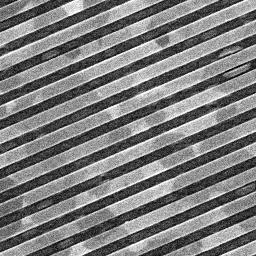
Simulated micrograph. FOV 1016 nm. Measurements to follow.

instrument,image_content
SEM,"parallel lines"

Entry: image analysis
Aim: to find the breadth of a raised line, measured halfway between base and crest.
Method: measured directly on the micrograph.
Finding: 46.9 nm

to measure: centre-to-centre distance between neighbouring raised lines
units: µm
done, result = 0.0891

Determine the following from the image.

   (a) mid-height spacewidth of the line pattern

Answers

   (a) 40.5 nanometres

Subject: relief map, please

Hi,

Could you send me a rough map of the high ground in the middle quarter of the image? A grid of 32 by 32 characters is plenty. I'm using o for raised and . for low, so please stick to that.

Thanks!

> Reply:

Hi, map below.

.......oooooooo......oooooooo...
.....oooooooo......ooooooo......
...ooooooo.......ooooooo.......o
.ooooooo.......ooooooo.......ooo
oooooo......oooooooo.......ooooo
ooo.......ooooooo.......oooooooo
o.......ooooooo.......ooooooo...
.....oooooooo.......ooooooo.....
...ooooooo.......oooooooo......o
.ooooooo.......ooooooo.......ooo
oooooo.......ooooooo.......ooooo
ooo.......oooooooo......oooooooo
o.......ooooooo.......ooooooo...
......ooooooo.......ooooooo.....
....ooooooo......oooooooo.......
.ooooooo.......ooooooo.......ooo
oooooo.......ooooooo.......ooooo
oooo......oooooooo.......ooooooo
oo......ooooooo........ooooooo..
......ooooooo.......oooooooo....
....ooooooo.......ooooooo.......
.oooooooo.......ooooooo......ooo
oooooo.......oooooooo......ooooo
oooo.......ooooooo.......ooooooo
oo.......ooooooo.......ooooooo..
......oooooooo......oooooooo....
....ooooooo.......ooooooo.......
..ooooooo.......ooooooo.......oo
ooooooo......oooooooo.......oooo
oooo.......ooooooo.......ooooooo
oo.......ooooooo.......ooooooo..
......oooooooo.......ooooooo....